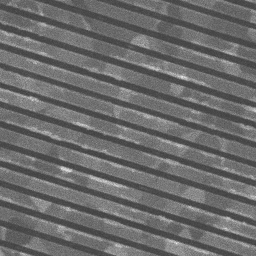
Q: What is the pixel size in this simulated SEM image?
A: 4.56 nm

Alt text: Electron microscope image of parallel lines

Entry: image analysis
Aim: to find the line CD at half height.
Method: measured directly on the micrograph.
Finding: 54.5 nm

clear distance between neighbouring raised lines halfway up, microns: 0.0273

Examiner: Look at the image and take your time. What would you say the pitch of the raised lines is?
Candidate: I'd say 0.0857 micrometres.